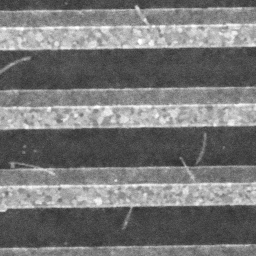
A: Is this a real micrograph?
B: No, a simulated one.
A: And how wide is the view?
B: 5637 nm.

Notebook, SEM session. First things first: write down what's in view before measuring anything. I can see lines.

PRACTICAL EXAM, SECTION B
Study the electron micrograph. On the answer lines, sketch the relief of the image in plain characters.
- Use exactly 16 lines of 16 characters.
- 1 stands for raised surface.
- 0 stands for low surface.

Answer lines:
0000000000000000
1111111111111111
1111111111111111
0000000000000000
0000000000000000
0000000000000011
1111111111111111
1111111111111111
0000000000000000
0000000000000000
0000000000111111
1111111111111111
1111111111111111
0000000000000000
0000000000000000
0000111111111111